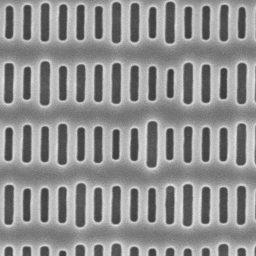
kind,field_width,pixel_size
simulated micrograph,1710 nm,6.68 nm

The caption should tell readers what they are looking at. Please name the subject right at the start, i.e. a regular array of holes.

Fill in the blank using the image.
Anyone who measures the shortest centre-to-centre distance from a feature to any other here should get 0.117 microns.